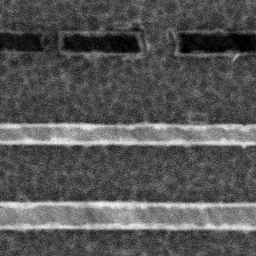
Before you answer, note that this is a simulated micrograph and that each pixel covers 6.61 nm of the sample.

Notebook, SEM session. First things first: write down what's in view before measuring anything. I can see one or a few lines or trenches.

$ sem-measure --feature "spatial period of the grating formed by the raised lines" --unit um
0.568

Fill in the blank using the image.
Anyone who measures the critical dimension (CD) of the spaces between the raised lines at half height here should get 415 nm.